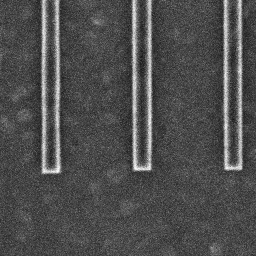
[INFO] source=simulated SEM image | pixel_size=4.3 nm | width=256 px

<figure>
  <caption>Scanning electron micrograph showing one or a few lines or trenches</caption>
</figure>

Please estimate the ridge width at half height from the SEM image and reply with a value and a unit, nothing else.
14.6 pixels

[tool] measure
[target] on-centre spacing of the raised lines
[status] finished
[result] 91.2 px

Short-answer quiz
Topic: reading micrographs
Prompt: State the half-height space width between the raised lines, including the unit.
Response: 0.325 um